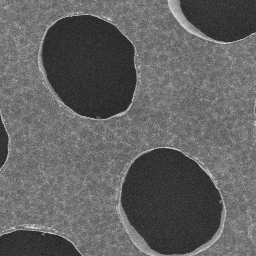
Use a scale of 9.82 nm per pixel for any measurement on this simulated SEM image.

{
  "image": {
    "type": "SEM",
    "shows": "holes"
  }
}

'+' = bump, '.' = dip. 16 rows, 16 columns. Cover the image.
+++++++++++.....
+++....+++++....
+++.....+++++..+
++......++++++++
+++.....++++++++
+++.....++++++++
++++....++++++++
++++++++++++++++
++++++++++++++++
+++++++++..+++++
++++++++.....+++
++++++++.....+++
++++++++......++
++++++++......++
+..+++++......++
.....++++....+++